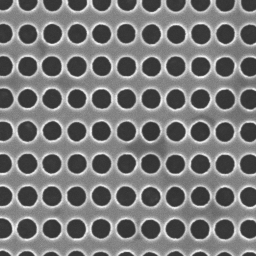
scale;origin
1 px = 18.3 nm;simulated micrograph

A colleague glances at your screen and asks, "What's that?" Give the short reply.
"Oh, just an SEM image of a regular array of holes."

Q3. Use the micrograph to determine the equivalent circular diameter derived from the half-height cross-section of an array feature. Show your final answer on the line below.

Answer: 0.364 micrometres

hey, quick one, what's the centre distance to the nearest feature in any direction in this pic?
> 448 nm